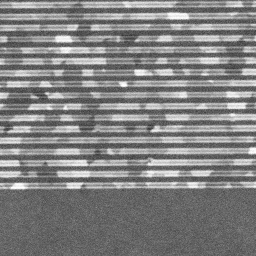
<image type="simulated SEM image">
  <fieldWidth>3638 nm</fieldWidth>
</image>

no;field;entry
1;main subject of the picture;parallel lines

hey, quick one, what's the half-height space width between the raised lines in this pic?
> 112 nanometers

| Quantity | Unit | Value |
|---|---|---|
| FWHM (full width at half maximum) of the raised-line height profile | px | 4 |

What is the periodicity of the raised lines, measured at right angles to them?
0.16 µm